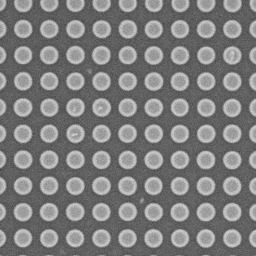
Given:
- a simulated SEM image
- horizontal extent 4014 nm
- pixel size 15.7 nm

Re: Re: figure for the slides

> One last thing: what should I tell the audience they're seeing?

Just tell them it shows an array of small figures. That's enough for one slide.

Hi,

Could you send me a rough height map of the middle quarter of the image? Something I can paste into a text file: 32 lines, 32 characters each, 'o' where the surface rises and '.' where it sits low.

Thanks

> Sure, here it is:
................................
................................
..oo....ooo....oo....ooo....oo..
.oooo..oooo...oooo..oooo...oooo.
.oooo..oooo...oooo..ooooo..oooo.
.oooo...ooo...oooo...ooo...oooo.
............................oo..
................................
................................
.oooo...ooo...oooo...ooo...oooo.
.oooo..ooooo..oooo..ooooo..oooo.
.oooo..ooooo..oooo..ooooo..oooo.
.ooo....ooo...ooo....ooo....oo..
................................
................................
..oo....oo.....oo....ooo....oo..
.oooo..oooo...oooo..oooo...oooo.
.oooo..ooooo..oooo..ooooo..oooo.
.oooo...ooo...oooo...ooo...oooo.
..o......o.....oo.....o.....oo..
................................
................................
.oooo...ooo...oooo...ooo...oooo.
.oooo..oooo...oooo..ooooo..oooo.
.oooo..oooo...oooo..ooooo..oooo.
.ooo....ooo...oooo...ooo...oooo.
................................
................................
........oo.....oo.....o.....oo..
.oooo..oooo...oooo...ooo...oooo.
.oooo..ooooo..oooo..oooo...oooo.
.oooo..oooo...oooo..oooo...oooo.